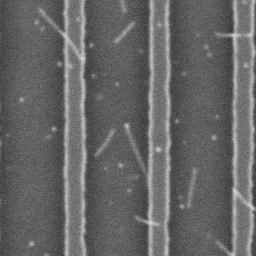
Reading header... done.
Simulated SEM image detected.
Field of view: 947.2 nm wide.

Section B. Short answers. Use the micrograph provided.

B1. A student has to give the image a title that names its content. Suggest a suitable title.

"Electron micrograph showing lines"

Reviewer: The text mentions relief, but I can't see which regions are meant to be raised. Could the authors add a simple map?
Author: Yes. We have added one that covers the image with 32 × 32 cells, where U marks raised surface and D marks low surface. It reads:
DDDDDDDDUUDDDDDDDDDUUDDDDDDDDUUU
DDDDDDDDUUDDDDDDDDDUUDDDDDDDDUUU
DDDDDDDDUUUDDDDDDDDUUDDDDDDDDUUU
DDDDDDDDUUUDDDDDDDDUUDDDDDDDDUUU
DDDDDDDDUUDDDDDDDDDUUDDDDDDDDUUU
DDDDDDDDUUDDDDDDDDDUUDDDDDDDDUUU
DDDDDDDDUUUDDDDDDDDUUDDDDDDDDUUU
DDDDDDDDUUUDDDDDDDDUUDDDDDDDDUUU
DDDDDDDDUUDDDDDDDDDUUDDDDDDDDUUU
DDDDDDDDUUDDDDDDDDDUUDDDDDDDDUUU
DDDDDDDDUUUDDDDDDDDUUDDDDDDDDUUU
DDDDDDDDUUUDDDDDDDDUUDDDDDDDDUUU
DDDDDDDDUUUDDDDDDDDUUDDDDDDDDUUU
DDDDDDDDUUDDDDDDDDDUUDDDDDDDDUUU
DDDDDDDDUUUDDDDDDDDUUDDDDDDDDUUU
DDDDDDDDUUUDDDDDDDDUUDDDDDDDDUUU
DDDDDDDDUUUDDDDDDDDUUDDDDDDDDUUU
DDDDDDDDUUUDDDDDDDDUUDDDDDDDDUUU
DDDDDDDDUUUDDDDDDDDUUDDDDDDDDUUU
DDDDDDDDUUUDDDDDDDDUUDDDDDDDDUUU
DDDDDDDDUUUDDDDDDDDUUDDDDDDDDUUU
DDDDDDDDUUUDDDDDDDDUUDDDDDDDDUUD
DDDDDDDDUUDDDDDDDDDUUDDDDDDDDUUD
DDDDDDDDUUUDDDDDDDDUUDDDDDDDDUUD
DDDDDDDDUUDDDDDDDDDUUDDDDDDDDUUD
DDDDDDDDUUUDDDDDDDDUUDDDDDDDDUUU
DDDDDDDDUUUDDDDDDDDUUDDDDDDDDUUU
DDDDDDDDUUUDDDDDDDUUUDDDDDDDDUUU
DDDDDDDDUUUDDDDDDDDUUDDDDDDDDUUU
DDDDDDDDUUDDDDDDDDDUUDDDDDDDDUUD
DDDDDDDDUUUDDDDDDDDUUDDDDDDDDUUD
DDDDDDDDUUUDDDDDDDDUUDDDDDDDDUUD